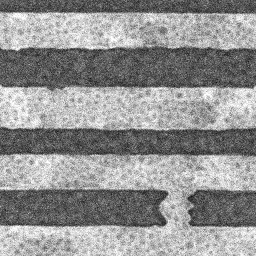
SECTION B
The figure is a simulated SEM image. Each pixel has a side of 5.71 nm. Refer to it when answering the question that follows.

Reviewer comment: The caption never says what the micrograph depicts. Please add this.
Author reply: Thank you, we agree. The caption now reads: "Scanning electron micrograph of one or a few lines or trenches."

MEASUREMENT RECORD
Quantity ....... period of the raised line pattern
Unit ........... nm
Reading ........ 407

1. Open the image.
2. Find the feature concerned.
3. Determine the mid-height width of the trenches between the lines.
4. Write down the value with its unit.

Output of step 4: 215 nm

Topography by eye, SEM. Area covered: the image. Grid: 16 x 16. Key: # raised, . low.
................
################
################
................
................
#.....###.......
################
################
................
................
################
################
..........##....
..........##....
################
################